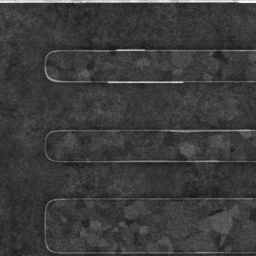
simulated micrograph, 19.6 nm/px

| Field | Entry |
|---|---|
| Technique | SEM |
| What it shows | groups of lines, slits or small figures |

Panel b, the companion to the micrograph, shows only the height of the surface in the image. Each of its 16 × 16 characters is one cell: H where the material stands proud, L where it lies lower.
LLLLLLLLLLLLLLLL
LLLLLLLLLLLLLLLL
LLLLLLLLLLLLLLLL
LLLHHHHHHHHHHHHH
LLLHHHHHHHHHHHHH
LLLLLLLLLLLLLLLL
LLLLLLLLLLLLLLLL
LLLLLLLLLLLLLLLL
LLLHHHHHHHHHHHHH
LLLHHHHHHHHHHHHH
LLLLLLLLLLLLLLLL
LLLLLLLLLLLLLLLL
LLLHHHHHHHHHHHHH
LLLHHHHHHHHHHHHH
LLLHHHHHHHHHHHHH
LLLHHHHHHHHHHHHH